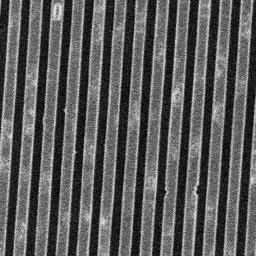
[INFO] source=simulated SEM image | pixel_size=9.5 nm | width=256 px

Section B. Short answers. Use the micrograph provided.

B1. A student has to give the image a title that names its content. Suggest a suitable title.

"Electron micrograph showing parallel lines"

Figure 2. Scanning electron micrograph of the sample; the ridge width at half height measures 112 nanometres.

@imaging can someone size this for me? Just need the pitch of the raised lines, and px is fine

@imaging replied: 21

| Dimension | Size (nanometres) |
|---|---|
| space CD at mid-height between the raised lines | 87.6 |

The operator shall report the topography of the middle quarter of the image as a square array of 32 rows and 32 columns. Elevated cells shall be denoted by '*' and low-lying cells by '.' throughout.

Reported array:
.***..***...**...***..***...**..
.***..***...**...**...***..***..
.***..***...**...**...***..***..
.***..***...**...**...***..***..
.***..***..***...**...***..***..
.***..***...**...**...***..***..
.***..***...**...**...***..***..
.**...***..***...**...***..***..
.**...***..***..***...**...***..
.**...***..***..***...**...***..
***...***..***..***...**...***..
***...**...***..***...**...***..
***...**...***..***..***...**...
***...**...***..***..***...**...
***..***...***..***..***...**...
***..***...**...***..***...**...
***..***...**...***..***..***...
***..***...**...***..***..***...
***..***..***...***..***..***...
***..***..***...**...***..***..*
***..***..***...**...***..***..*
***..***..***...**...***..***..*
***..***..***...**...***..***..*
**...***..***..***...**...***..*
**...***..***..***...**...***..*
**...***..***..***...**...***..*
**...**...***..***..***...***..*
**...**...***..***..***...**...*
**...**...***..***..***...**...*
**..***...***..***..***...**...*
**..***...**...***..***..***...*
**...**...**...***..***..***...*